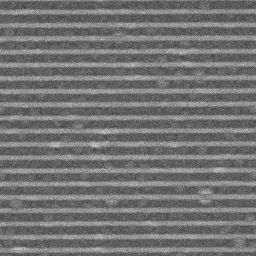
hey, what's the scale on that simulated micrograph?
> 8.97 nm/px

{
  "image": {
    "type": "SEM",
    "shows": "parallel lines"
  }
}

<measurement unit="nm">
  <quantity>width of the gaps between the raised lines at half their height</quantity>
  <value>86.3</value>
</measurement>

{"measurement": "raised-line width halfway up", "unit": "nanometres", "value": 34.8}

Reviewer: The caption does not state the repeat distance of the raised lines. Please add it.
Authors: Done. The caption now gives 13.2 pixels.